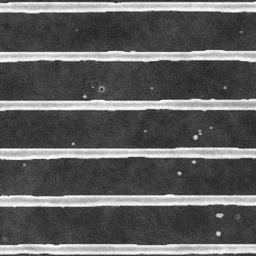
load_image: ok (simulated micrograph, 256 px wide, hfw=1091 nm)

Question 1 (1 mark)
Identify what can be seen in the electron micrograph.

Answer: lines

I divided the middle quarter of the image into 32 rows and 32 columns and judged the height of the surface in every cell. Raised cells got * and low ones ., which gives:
................................
................................
................................
................................
................................
................................
................................
................................
................................
********************************
********************************
................................
................................
................................
................................
................................
................................
................................
................................
................................
................................
********************************
********************************
................................
................................
................................
................................
................................
................................
................................
................................
................................